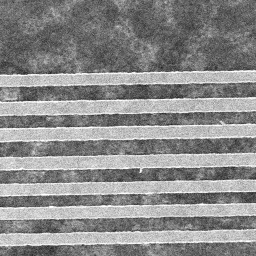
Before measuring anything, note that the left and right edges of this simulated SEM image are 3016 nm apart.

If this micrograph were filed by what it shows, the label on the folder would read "parallel lines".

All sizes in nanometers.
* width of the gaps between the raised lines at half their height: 162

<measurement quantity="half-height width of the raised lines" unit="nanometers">143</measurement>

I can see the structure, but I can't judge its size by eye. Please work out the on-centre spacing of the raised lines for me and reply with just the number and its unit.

313 nm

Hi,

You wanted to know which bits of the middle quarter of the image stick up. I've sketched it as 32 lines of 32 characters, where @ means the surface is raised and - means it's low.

--------------------------------
--------------------------------
--------@@@@@@@@@@@@@@@@@@@@@@@@
@@@@@@@@@@@@@@@@@@@@@@@@@@@@@@@@
@@@@@@@@@@@@@@@@@@@@@@@@@@@@@@@@
--------------------------------
--------------------------------
--------------------------------
--------------------------------
@@@@@@@@@@@@@@@@@@@@@@@@@@@@@@@@
@@@@@@@@@@@@@@@@@@@@@@@@@@@@@@@@
@@@@@@@@@@@@@@@@@@@@@@@@@@@@@@@@
-----@@@------------------------
--------------------------------
--------------------------------
---------------------------@--@@
@@@@@@@@@@@@@@@@@@@@@@@@@@@@@@@@
@@@@@@@@@@@@@@@@@@@@@@@@@@@@@@@@
@@@@@@@@@@@@@@@@@@@@@@@@@@----@@
--------------------------------
-----------------------@--------
-----------------------@@-------
--------------------------------
@@@@@@@@@@@@@@@@@@@@@@@@@@@@@@@@
@@@@@@@@@@@@@@@@@@@@@@@@@@@@@@@@
@@@@@@@@@@@@@@@@@@@@@@@@@@@@@@@@
--------------------------------
--------------------------------
--------------------------------
-----------------------@@@@@@@@@
@@@@@@@@@@@@@@@@@@@@@@@@@@@@@@@@
@@@@@@@@@@@@@@@@@@@@@@@@@@@@@@@@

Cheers